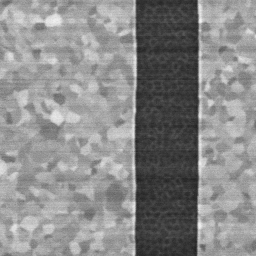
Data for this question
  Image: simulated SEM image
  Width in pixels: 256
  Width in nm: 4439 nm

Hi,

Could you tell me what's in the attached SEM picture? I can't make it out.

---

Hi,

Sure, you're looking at one or a few lines or trenches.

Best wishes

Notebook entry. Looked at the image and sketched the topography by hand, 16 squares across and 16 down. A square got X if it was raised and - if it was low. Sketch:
XXXXXXXX----XXXX
XXXXXXXX-----XXX
XXXXXXXX-----XXX
XXXXXXXX-----XXX
XXXXXXXX-----XXX
XXXXXXXX-----XXX
XXXXXXXX-----XXX
XXXXXXXX-----XXX
XXXXXXXX-----XXX
XXXXXXXX-----XXX
XXXXXXXX----XXXX
XXXXXXXX----XXXX
XXXXXXXX----XXXX
XXXXXXXX----XXXX
XXXXXXXX----XXXX
XXXXXXXX----XXXX